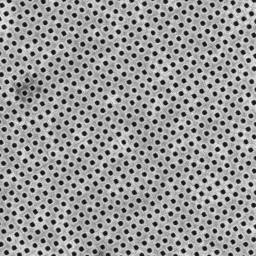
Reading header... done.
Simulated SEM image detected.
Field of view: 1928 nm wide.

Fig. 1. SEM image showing a regular array of holes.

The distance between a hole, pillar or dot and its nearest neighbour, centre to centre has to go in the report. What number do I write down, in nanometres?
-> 67.8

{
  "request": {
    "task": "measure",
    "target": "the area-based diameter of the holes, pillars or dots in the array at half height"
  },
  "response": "38.9 nanometers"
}